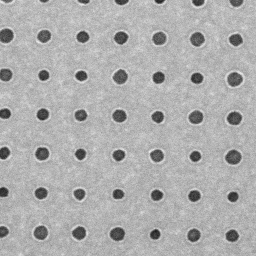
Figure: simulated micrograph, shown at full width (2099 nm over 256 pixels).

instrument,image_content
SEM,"a regular array of holes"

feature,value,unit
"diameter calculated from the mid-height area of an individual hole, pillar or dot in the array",0.114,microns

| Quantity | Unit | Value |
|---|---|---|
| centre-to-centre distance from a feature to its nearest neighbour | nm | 312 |